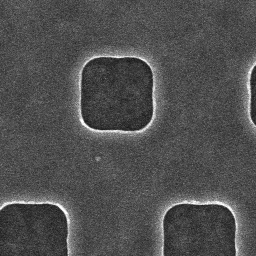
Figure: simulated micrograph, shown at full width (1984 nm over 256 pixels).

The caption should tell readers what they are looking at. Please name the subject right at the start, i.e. holes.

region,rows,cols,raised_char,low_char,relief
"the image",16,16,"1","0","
1111111111111111
1111111111111111
1111111111111111
1111111111111111
1111100001111111
1111100000111111
1111100000111111
1111100001111111
1111111111111111
1111111111111111
1111111111111111
1111111111111111
1111111111111111
0000111111000001
0000111111000001
0000111111000001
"